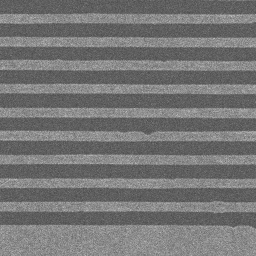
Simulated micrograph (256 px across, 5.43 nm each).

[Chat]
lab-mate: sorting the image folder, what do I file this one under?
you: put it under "parallel lines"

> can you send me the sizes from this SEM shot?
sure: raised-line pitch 128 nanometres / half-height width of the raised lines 51.5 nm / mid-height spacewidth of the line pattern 75.3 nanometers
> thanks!